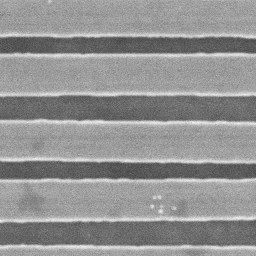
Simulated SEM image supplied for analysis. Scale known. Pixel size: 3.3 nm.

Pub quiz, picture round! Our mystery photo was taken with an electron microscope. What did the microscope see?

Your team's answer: lines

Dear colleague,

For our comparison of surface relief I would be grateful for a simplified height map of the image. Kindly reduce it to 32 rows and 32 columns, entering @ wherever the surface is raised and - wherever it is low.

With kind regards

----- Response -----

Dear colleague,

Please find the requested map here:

@@@@@@@@@@@@@@@@@@@@@@@@@@@@@@@@
@@@@@@@@@@@@@@@@@@@@@@@@@@@@@@@@
@@@@@@@@@@@@@@@@@@@@@@@@@@@@@@@@
@@@@@@@@@@@@@@@@@@@@@@@@@@@@@@@@
@-----@@@-@@@-----@@@@@@@@-@-@@@
--------------------------------
--------------------------------
@@@@@@@@@@@@@@@@@@@@@@@@@@@@@@@@
@@@@@@@@@@@@@@@@@@@@@@@@@@@@@@@@
@@@@@@@@@@@@@@@@@@@@@@@@@@@@@@@@
@@@@@@@@@@@@@@@@@@@@@@@@@@@@@@@@
@@@@@@@@@@@@@@@@@@@@@@@@@@@@@@@@
--------------------------------
--------------------------------
--------------------------------
@@@@@@@@@@@@@@@@@@@@@@@@@@@@@@@@
@@@@@@@@@@@@@@@@@@@@@@@@@@@@@@@@
@@@@@@@@@@@@@@@@@@@@@@@@@@@@@@@@
@@@@@@@@@@@@@@@@@@@@@@@@@@@@@@@@
@@@@@@@@@@@@@@@@@@@@@@@@@@@@@@@@
--------------------------------
--------------------------------
-----@@@@-@@@@@@----@@@@@@@@@-@@
@@@@@@@@@@@@@@@@@@@@@@@@@@@@@@@@
@@@@@@@@@@@@@@@@@@@@@@@@@@@@@@@@
@@@@@@@@@@@@@@@@@@@@@@@@@@@@@@@@
@@@@@@@@@@@@@@@@@@@@@@@@@@@@@@@@
@@@@@@@@@@@@@@@@@@@@@@@@@@@-----
--------------------------------
--------------------------------
--------------------------------
@@@@@@@@@@@@@@@@@@@@@@@@@@@@@@@@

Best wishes